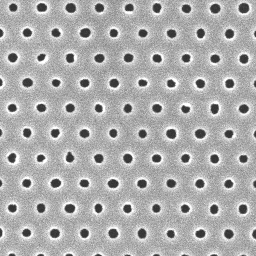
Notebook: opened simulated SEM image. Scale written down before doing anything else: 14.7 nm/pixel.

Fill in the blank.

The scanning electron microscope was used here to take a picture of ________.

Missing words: a regular array of holes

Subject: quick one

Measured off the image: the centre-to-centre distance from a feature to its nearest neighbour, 0.419 µm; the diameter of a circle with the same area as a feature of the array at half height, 143 nm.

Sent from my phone